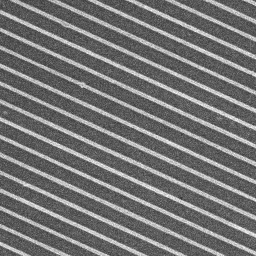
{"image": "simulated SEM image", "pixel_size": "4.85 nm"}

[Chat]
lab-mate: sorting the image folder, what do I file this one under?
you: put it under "parallel lines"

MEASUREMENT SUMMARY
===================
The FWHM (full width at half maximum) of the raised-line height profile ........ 2.85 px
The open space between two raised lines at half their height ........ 13.1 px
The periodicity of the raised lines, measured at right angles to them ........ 0.0786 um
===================